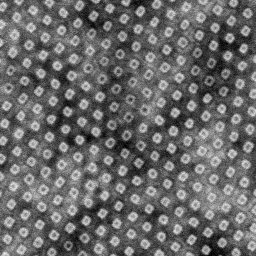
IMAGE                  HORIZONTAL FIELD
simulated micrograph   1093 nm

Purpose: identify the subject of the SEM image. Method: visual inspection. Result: a regular array of raised bodies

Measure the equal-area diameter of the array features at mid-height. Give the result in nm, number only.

36.4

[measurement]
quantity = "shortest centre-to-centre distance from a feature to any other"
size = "74.4 nanometers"